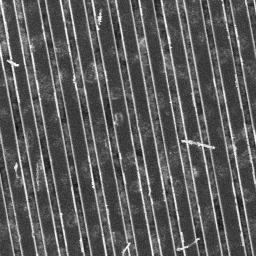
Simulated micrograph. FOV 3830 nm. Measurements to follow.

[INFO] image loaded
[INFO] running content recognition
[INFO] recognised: parallel lines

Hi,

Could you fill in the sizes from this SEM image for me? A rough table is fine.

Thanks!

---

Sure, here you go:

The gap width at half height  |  114 nm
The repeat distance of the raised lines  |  341 nm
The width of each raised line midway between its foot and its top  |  15.4 px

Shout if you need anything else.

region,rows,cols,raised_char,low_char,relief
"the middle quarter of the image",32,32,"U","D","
UUDDUUUUDDUUUUDDUUUDDDUUUDDUUUUD
UUDDUUUUDDUUUUDDUUUUDDUUUDDUUUUD
UUDDDUUUDDUUUUDDUUUUDDUUUUDDUUUD
UUUDDUUUDDDUUUDDUUUUDDUUUUDDUUUU
UUUDDUUUUDDUUUUDDUUUDDUUUUDDUUUU
UUUDDUUUUDDUUUUDDUUUDDDUUUDDUUUU
UUUDDUUUUDDUUUUDDUUUDDDUUUDDUUUU
UUUDDUUUUDDUUUUDDUUUUDDUUUDDDUUU
UUUUDDUUUDDUUUUDDUUUUDDUUUUDDUUU
UUUUDDUUUUDDUUUDDUUUUDDUUUUDDUUU
UUUUDDUUUUDDUUUUDDUUUDDUUUUDDUUU
UUUUDDUUUUDDUUUUDDUUUDDDUUUDDUUU
UUUUDDUUUUDDUUUUDDUUUUDDUUUDDUUU
DUUUDDUUUUDDUUUUDDUUUUDDUUUUDDUU
DUUUUDDUUUDDUUUUDDUUUUDDUUUUDDUU
DUUUUDDUUUUDUUUUDDUUUUDDUUUUDDUU
DUUUUDDUUUUDDUUUUDDUUUDDDUUUDDUU
DUUUUDDUUUUDDUUUUDDUUUDDDUUUDDUU
DDUUUDDUUUUDDUUUUDDUUUUDDUUUDDDU
DDUUUUDDUUUDDUUUUDDUUUUDDUUUUDUU
DDUUUUDDUUUUDUUUUDDUUUUDDUUUUDDU
DDUUUUDDUUUUDDUUUUDDUUUDDUUUUDDU
DDUUUUDDUUUUDDUUUUDDUUUDDDUUUDDU
UDUUUUDDUUUUDDUUUUDDUUUUDDUUUDDU
UDDUUUUDUUUUDDUUUUDDUUUUDDUUUUDD
UDDUUUUDDUUUDDUUUUDDUUUUDDUUUUDD
UDDUUUUDDUUUUDUUUUDDDUUUDDUUUUDD
UDDUUUUDDUUUUDDUUUUDDUUUDDDUUUDD
UUDUUUUDDUUUUDDUUUUDDUUUDDDUUUDD
UUDDUUUDDUUUUDDUUUUDDUUUUDDUUUDD
UUDDUUUDDDUUUDDUUUUDDUUUUDDUUUUD
UUDDUUUUDDUUUUDDUUUDDUUUUDDUUUUD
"